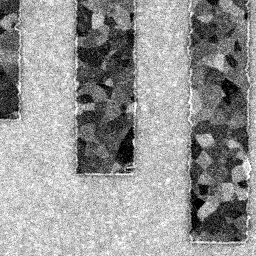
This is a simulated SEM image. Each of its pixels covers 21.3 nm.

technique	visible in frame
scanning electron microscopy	one or a few lines or trenches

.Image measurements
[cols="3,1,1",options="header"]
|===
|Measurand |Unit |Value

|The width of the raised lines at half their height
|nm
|1250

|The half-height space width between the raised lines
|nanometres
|1180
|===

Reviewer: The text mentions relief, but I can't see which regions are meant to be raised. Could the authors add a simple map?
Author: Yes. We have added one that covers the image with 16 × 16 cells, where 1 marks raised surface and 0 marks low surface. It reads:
1000011100001111
1000011100001111
1000011100001111
1000011100001111
1000011100001111
1000011100001111
1000011100001111
0000011100001111
0000011100001111
0000011100001111
0000011100001111
0000000000001111
0000000000001111
0000000000001111
0000000000001110
0000000000000000